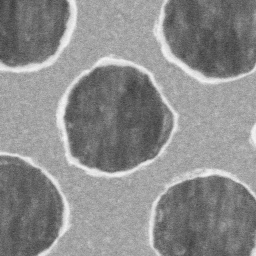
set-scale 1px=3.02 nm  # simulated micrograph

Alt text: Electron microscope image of holes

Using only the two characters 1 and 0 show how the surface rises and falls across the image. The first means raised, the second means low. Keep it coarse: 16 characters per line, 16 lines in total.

0000111111000000
0000111111000000
0000111111000000
0001111111100000
1111100001110000
1111000000111111
1111000000111111
1111000000011111
1111000000011111
1111000000111111
0011110011111111
0001111111100001
0000111111000000
0000111111000000
0000111110000000
0001111111000000